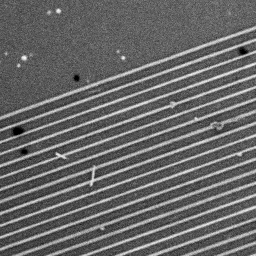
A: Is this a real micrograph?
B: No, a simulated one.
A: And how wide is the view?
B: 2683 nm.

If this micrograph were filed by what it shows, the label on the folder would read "parallel lines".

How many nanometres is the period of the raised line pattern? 118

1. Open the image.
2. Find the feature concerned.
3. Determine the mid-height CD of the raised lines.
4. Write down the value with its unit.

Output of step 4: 2.36 px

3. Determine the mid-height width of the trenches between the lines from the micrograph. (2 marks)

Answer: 99.9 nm